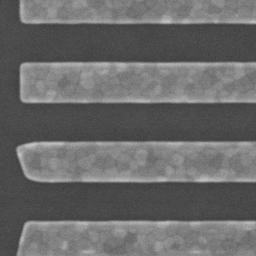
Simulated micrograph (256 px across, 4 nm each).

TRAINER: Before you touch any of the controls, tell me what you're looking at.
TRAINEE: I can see wiring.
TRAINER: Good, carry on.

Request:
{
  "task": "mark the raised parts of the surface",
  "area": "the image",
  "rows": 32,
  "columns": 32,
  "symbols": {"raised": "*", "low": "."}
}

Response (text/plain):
...*****************************
...*****************************
...*****************************
................................
................................
................................
................................
................................
...*****************************
...*****************************
...*****************************
...*****************************
...*****************************
................................
................................
................................
................................
................................
..******************************
..******************************
...*****************************
...*****************************
....****************************
................................
................................
................................
................................
................................
...*****************************
...*****************************
...*****************************
..******************************